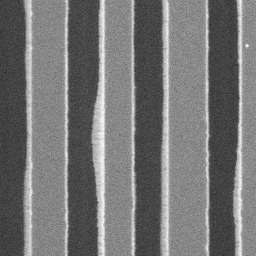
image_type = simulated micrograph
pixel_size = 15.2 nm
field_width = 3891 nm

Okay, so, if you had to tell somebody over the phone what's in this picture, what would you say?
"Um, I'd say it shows lines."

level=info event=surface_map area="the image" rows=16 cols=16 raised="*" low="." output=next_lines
..**..**..***..*
..**..**..***..*
..**..**..***..*
..**..**..***..*
..**..**..***..*
..**..**..***..*
..**..**..***..*
..**..**..***..*
..**..**..***..*
..**..**..***..*
..**..**..***..*
..**..**..***..*
..**..**..***..*
..**..**..***..*
..**..**..***..*
..**..**..***..*